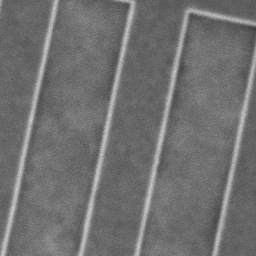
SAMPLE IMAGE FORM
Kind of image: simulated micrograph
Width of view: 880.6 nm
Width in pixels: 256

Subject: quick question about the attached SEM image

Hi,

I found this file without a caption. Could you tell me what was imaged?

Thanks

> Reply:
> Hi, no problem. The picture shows one or a few lines or trenches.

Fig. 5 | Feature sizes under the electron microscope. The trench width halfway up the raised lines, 257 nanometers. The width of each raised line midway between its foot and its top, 192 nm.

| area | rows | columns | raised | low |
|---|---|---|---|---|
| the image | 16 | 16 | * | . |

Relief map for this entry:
***.....********
***.....****....
***.....***.....
***.....***.....
***....****.....
**.....****....*
**.....****....*
**.....***.....*
**.....***.....*
**....****.....*
*.....****.....*
*.....***.....**
*.....***.....**
*.....***.....**
*....****.....**
.....****....***